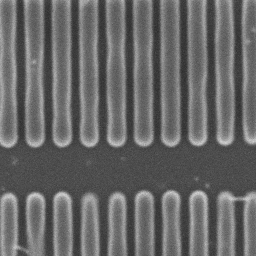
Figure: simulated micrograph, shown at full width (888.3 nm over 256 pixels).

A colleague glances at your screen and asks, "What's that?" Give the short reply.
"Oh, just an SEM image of groups of lines, slits or small figures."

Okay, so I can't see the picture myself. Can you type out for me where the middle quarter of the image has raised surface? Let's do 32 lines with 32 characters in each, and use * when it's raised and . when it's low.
*...****...****...****..*****..*
*...****...****...****..*****..*
*...****...****...****..*****..*
*...****...****...****..*****..*
*...****...****...****..*****..*
*...****...****...****..*****..*
*...****...****...****..*****...
*...****...****...****..*****...
*....***...****...****..*****...
*....***...****...****..*****..*
*....***...****...****...****..*
*....***...****...****...****..*
*....***...****...****...****..*
*....***...****...****...****..*
*....***...****...****...****..*
**..****...****...****..*****..*
**..****...****...****..*****..*
**..****...****...****..*****..*
**..****...****...****..*****..*
*....***...****...****...****...
................................
................................
................................
................................
................................
................................
................................
................................
................................
................................
................................
................................